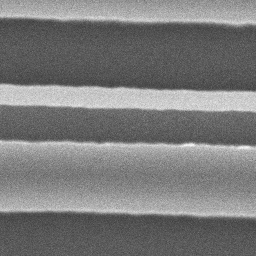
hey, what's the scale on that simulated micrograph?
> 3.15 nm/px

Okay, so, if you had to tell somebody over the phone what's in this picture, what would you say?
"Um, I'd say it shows lines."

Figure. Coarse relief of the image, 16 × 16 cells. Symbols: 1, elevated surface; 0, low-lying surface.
1111111111111111
0000000000000000
0000000000000000
0000000000000000
0000000000000000
1111110000000000
1111111111111111
1111111111111111
1111111111111111
1111111111111111
1111111111111111
1111111111111111
1111111111111111
0000000000000000
0000000000000000
0000000000000000